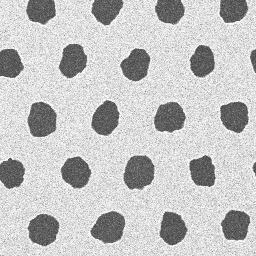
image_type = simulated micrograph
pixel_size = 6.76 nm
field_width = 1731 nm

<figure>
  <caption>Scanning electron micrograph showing a regular array of holes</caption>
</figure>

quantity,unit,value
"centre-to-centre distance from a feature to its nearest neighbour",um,0.426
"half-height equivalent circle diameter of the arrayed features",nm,203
